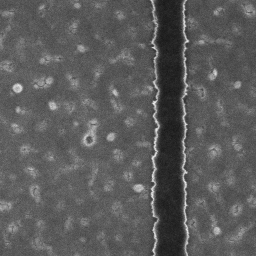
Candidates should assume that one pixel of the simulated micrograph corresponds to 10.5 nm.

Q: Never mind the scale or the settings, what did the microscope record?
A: one or a few lines or trenches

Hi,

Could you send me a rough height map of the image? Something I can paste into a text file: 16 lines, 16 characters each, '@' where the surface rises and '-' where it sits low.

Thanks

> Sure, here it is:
----------@@----
----------@@----
----------@@----
----------@@----
----------@@----
----------@@----
----------@@----
----------@@----
----------@@----
----------@@----
----------@@----
----------@@----
---------@@@----
----------@@----
----------@@----
----------@@----